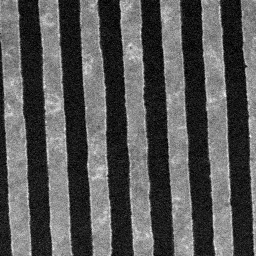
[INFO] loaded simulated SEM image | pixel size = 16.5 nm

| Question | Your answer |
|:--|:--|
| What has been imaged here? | parallel lines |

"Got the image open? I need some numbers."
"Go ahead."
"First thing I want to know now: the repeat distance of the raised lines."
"666 nanometres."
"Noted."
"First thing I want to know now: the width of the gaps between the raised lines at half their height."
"364 nanometers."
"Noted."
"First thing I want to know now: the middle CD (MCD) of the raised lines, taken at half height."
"302 nm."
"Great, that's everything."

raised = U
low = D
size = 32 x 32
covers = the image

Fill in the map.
UUDDDUUDDDUUDDDUUUDDUUDDDUUDDDUU
UUDDDUUDDDUUDDDUUUDDUUUDDUUDDDUU
UUDDDUUDDDUUDDDUUUDDUUUDDUUUDDUU
UUDDDUUDDDUUDDDUUUDDUUUDDUUUDDUU
UUDDDUUDDDUUDDDUUUDDUUUDDUUUDDUU
UUDDDUUDDDUUDDDUUUDDUUUDDUUUDDUU
UUDDDUUUDDUUUDDUUUDDUUUDDDUUDDUU
UUDDDUUUDDUUUDDUUUDDDUUDDDUUDDDU
UUUDDUUUDDUUUDDDUUDDUUUDDDUUDDDU
DUUDDUUUDDUUUDDDUUDDDUUDDDUUDDDU
UUUDDDUUDDUUUDDDUUDDDUUDDDUUDDDU
DUUDDDUUDDDUUDDDUUDDDUUDDDUUDDDU
DUUDDDUUDDDUUDDDUUDDDUUDDDUUDDDU
DUUDDDUUDDDUUDDDUUDDDUUDDDUUDDDU
DUUDDDUUDDDUUDDDUUDDDUUDDDUUDDDU
DUUDDDUUDDDUUDDDUUDDDUUDDDUUDDDU
DUUDDDUUDDDUUDDDUUDDDUUDDDUUDDDU
DUUDDDUUDDDUUDDDUUDDDUUDDDUUDDDU
DUUDDDUUDDDUUDDDUUDDDUUDDDUUDDDU
DUUDDDUUDDDUUDDDUUDDDUUDDDUUDDDU
DUUDDDUUDDDUUDDDUUDDDUUDDDUUDDDU
DUUDDDUUDDDUUDDDUUDDDUUDDDUUUDDU
DUUDDDUUDDDUUDDDUUUDDUUUDDUUUDDU
DUUDDDUUUDDUUUDDUUUDDUUUDDDUUDDD
DUUUDDUUUDDUUUDDUUUDDUUUDDDUUDDD
DUUUDDUUUDDUUUDDUUUDDDUUDDDUUDDD
DUUUDDUUUDDUUUDDUUUDDDUUDDDUUDDD
DUUUDDUUUDDUUUDDDUUDDDUUDDDUUDDD
DUUUDDUUUDDDUUDDDUUDDDUUDDDUUDDD
DUUUDDUUUDDDUUDDDUUDDDUUDDDUUDDD
DDUUDDDUUDDDUUDDDUUDDDUUDDDUUDDD
DDUUDDDUUDDDUUDDDUUDDDUUDDDUUDDD